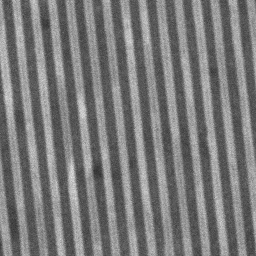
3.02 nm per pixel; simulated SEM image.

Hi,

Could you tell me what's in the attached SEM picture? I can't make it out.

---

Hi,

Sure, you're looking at parallel lines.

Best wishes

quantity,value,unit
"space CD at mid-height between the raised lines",34.4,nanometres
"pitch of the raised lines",0.0542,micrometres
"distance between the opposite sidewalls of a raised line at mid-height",18.3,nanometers